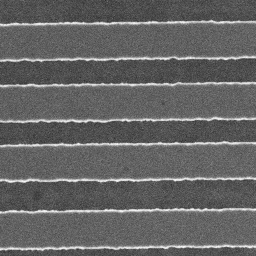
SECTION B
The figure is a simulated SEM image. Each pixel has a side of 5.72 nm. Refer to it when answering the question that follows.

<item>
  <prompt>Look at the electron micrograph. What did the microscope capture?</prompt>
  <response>lines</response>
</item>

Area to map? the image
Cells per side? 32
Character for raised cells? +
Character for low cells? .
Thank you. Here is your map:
................................
................................
................................
++++++++++++++++++++++++++++++++
++++++++++++++++++++++++++++++++
++++++++++++++++++++++++++++++++
++++++++++++++++++++++++++++++++
+++++++++++++++.................
................................
................................
..........++...+..++++++++++++++
++++++++++++++++++++++++++++++++
++++++++++++++++++++++++++++++++
++++++++++++++++++++++++++++++++
++++++++++++++++++++++++++++++++
................................
................................
................................
++++++++++++++++++++++++++++++++
++++++++++++++++++++++++++++++++
++++++++++++++++++++++++++++++++
++++++++++++++++++++++++++++++++
++++++++++++++++++++.++.........
................................
................................
................................
++++++++++++++++++++++++++++++++
++++++++++++++++++++++++++++++++
++++++++++++++++++++++++++++++++
++++++++++++++++++++++++++++++++
++++++++++++++++++++++++++++++++
................................